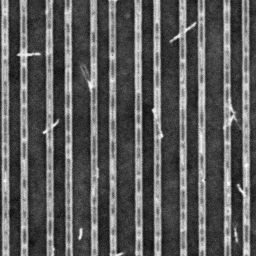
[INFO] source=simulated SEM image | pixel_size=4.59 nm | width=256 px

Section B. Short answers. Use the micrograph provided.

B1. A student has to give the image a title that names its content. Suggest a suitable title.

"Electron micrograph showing parallel lines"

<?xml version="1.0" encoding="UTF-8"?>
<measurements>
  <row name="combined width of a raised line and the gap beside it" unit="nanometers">100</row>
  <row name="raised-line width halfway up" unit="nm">30.4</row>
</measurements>